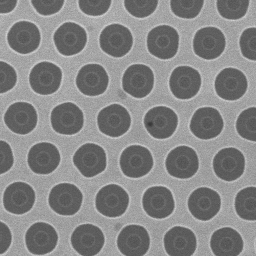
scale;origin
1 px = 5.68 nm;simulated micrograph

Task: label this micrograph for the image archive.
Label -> an array of small figures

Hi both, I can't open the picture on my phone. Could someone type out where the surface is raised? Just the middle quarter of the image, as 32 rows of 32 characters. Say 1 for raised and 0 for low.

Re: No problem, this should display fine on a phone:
11111000011111110000011111111001
11110000001111100000001111100000
11100000000111100000001111100000
11100000000111000000000111000000
11100000000111000000000111000000
11100000000111000000001111000000
11110000000111100000001111000000
11111000001111110000011111100000
11111111111111111100111111110000
10111111111111111111111111111111
00011111111000011111111001111111
00001111100000001111100000011111
00000111000000001111000000001111
00000111000000000111000000000111
00000111000000000111000000000110
00000111000000000111000000001110
00001111100000001111100000001110
00011111110000011111100000011111
11111111111101111111110000111111
11111111111111111111111111111111
11110000011111110000111111111001
11100000001111100000011111100000
11000000000111000000001111000000
11000000000111000000001110000000
11000000000111000000000110000000
11100000000111000000001110000000
11110000001111000000001111000000
11110000011111100000011111000000
11111111111111110001111111110001
11111111111111111111111111111111
00011111110000111111110001111111
00001111100000011111100000011111